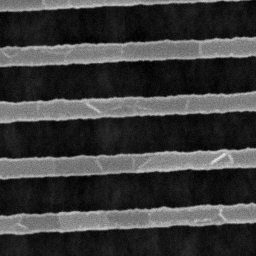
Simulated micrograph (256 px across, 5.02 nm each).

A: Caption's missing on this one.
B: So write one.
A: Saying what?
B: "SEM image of lines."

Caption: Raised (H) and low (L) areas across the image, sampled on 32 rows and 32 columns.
HHHHHHHHHHHHHHHHHHHLLLLLLLLLLLLL
LLLLLLLLLLLLLLLLLLLLLLLLLLLLLLLL
LLLLLLLLLLLLLLLLLLLLLLLLLLLLLLLL
LLLLLLLLLLLLLLLLLLLLLLLLLLLLLLLL
LLLLLLLLLLLLLLLLLLLLLLLLLLLLLLLL
LLLLLLLLLLHHHHHHHHHHHHHHHHHHHHHH
HHHHHHHHHHHHHHHHHHHHHHHHHHHHHHHH
HHHHHHHHHHHHHHHHHLLLLLLLLLLLLLLL
LLLLLLLLLLLLLLLLLLLLLLLLLLLLLLLL
LLLLLLLLLLLLLLLLLLLLLLLLLLLLLLLL
LLLLLLLLLLLLLLLLLLLLLLLLLLLLLLLL
LLLLLLLLLLLLLLLLLLLLLLLLLLLLLLLL
LLLLLLLHLLHHHHHHHHHHHHHHHHHHHHHH
HHHHHHHHHHHHHHHHHHHHHHHHHHHHHHHH
HHHHHHHHHHHHHHHHHHLLLLLLLLLLLLLL
LLLLLLLLLLLLLLLLLLLLLLLLLLLLLLLL
LLLLLLLLLLLLLLLLLLLLLLLLLLLLLLLL
LLLLLLLLLLLLLLLLLLLLLLLLLLLLLLLL
LLLLLLLLLLLLLLLLLLLLLLLLLLLLLLLL
LLLLLLLLLLLLLHHHHHHHHHHHHHHHHHHH
HHHHHHHHHHHHHHHHHHHHHHHHHHHHHHHH
HHHHHHHHHHHHHHHHHHLLLLLLLLLLLLLL
LLLLLLLLLLLLLLLLLLLLLLLLLLLLLLLL
LLLLLLLLLLLLLLLLLLLLLLLLLLLLLLLL
LLLLLLLLLLLLLLLLLLLLLLLLLLLLLLLL
LLLLLLLLLLLLLLLLLLLLLLLLLLLLLLLL
LLLLLLLLHHLHHHHHHHHHHHHHHHHHHHHH
HHHHHHHHHHHHHHHHHHHHHHHHHHHHHHHH
HHHHHHHHHHHHHHHHLLLLLLLLLLLLLLLL
LLLLLLLLLLLLLLLLLLLLLLLLLLLLLLLL
LLLLLLLLLLLLLLLLLLLLLLLLLLLLLLLL
LLLLLLLLLLLLLLLLLLLLLLLLLLLLLLLL